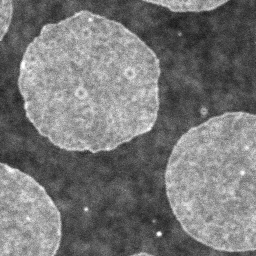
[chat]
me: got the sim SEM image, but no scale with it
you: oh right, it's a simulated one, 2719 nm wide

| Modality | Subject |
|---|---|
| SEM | raised bodies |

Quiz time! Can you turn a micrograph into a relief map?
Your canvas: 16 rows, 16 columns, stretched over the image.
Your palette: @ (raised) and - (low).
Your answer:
@----------@@---
---@@@@---------
--@@@@@@@-------
--@@@@@@@@------
-@@@@@@@@@------
-@@@@@@@@@------
--@@@@@@@@------
--@@@@@@@@---@@@
---@@@@@---@@@@@
-----------@@@@@
@---------@@@@@@
@@--------@@@@@@
@@@--------@@@@@
@@@@-------@@@@@
@@@@--------@@@@
@@@@----------@@